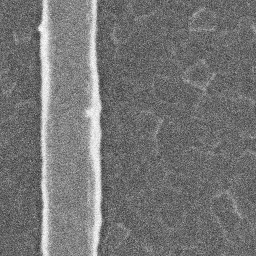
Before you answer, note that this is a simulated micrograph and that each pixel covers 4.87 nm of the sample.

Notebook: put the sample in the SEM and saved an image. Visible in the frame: one or a few lines or trenches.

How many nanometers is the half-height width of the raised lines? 252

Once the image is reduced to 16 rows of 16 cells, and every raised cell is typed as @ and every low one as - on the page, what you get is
---@@@----------
---@@@----------
---@@@----------
---@@@----------
---@@@----------
---@@@----------
---@@@----------
---@@@----------
---@@@----------
---@@@----------
---@@@----------
---@@@----------
---@@@----------
---@@@----------
---@@@----------
---@@@----------